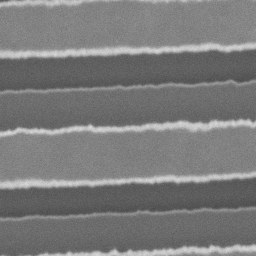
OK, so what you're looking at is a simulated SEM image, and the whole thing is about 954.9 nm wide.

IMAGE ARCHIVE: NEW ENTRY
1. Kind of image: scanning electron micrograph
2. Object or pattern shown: lines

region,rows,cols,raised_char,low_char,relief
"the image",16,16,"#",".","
################
################
################
####............
................
................
................
................
################
################
################
######..........
................
................
................
...........#####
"